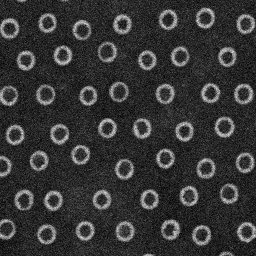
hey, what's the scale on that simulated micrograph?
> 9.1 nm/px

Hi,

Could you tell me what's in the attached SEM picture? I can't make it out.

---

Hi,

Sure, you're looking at a regular array of raised bodies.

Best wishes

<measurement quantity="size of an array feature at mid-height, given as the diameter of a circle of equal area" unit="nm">163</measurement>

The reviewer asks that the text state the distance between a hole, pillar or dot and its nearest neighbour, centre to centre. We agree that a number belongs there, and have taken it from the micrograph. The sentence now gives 307 nanometers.